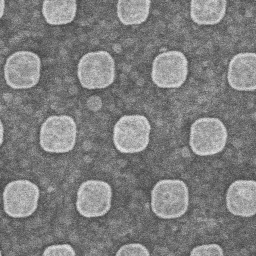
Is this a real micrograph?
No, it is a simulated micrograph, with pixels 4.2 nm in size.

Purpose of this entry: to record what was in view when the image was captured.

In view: a regular array of raised bodies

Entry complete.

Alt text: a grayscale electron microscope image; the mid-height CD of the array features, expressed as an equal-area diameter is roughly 150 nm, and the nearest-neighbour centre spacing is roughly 0.306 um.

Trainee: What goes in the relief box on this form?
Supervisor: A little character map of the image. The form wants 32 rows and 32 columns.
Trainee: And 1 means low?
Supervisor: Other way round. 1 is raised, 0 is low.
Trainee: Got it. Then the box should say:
00000011100000011110000011110000
00000011100000011110000011110000
00000011100000011100000011100000
00000000000000000000000000000000
00000000000000000000000000000000
00000000000000000000000000000000
00000000000000000000000000000000
01111000001111000001111000000111
01111000001111000001111000000111
01111000001111000001111000000111
01110000001111000000110000000111
00000000000000000000000000000000
00000000000000000000000000000000
00000000000000000000000000000000
00000000000000000000000000000000
00000011100000011100000011110000
00000111100000011100000011110000
00000111100000111100000011110000
00000011100000011100000011110000
00000000000000000000000000000000
00000000000000000000000000000000
00000000000000000000000000000000
00000000000000000000000000000000
01110000001111000001111000000111
01111000001111000001111000001111
01110000001111000001111000000111
01110000001110000001111000000111
00000000000000000000000000000000
00000000000000000000000000000000
00000000000000000000000000000000
00000000000000000000000000000000
00000011100000011100000011110000